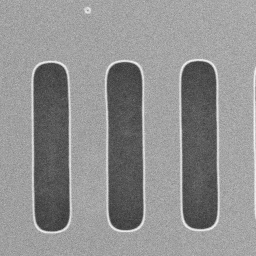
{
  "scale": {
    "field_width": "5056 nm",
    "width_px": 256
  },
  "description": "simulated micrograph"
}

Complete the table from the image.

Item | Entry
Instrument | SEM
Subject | groups of lines, slits or small figures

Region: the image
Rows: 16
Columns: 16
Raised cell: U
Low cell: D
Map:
UUUUUUUUUUUUUUUU
UUUUUUUUUUUUUUUU
UUUUUUUUUUUUUUUU
UUUUUUUUUUUUUUUU
UUDDUUUDDUUDDUUU
UUDDUUUDDUUDDDUU
UUDDUUUDDUUDDDUU
UUDDUUUDDUUDDDUU
UUDDUUUDDUUDDDUU
UUDDUUUDDUUDDDUU
UUDDUUUDDUUDDDUU
UUDDUUUDDUUDDDUU
UUDDUUUDDUUDDDUU
UUDDUUUDDUUDDDUU
UUUUUUUUUUUUUUUU
UUUUUUUUUUUUUUUU